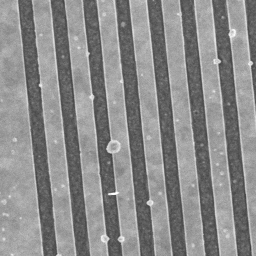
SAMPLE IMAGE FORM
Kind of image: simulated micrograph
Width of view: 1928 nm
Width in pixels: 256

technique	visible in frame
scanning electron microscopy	parallel lines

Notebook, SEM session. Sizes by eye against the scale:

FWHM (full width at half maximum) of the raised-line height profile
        126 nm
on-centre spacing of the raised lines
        242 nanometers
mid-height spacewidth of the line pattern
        112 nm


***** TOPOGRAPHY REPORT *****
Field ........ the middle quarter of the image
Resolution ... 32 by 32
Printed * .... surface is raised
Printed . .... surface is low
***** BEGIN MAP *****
..****....****....****....****..
..****....****....****....****..
..****....****....****....****..
..****....****.....****...*****.
..*****....****....****....****.
..*****....****....****....****.
...****....****....****....****.
...****....****....****....****.
...****....****....****....****.
...****....****....****....****.
...****....****....****....****.
...****....****....****....****.
...****....****....****....****.
...****....****.....****...*****
...*****....****....****....****
...*****....****....****....****
....****....****....****....****
....****....****....****....****
....****....****....****....****
....****...*****....****....****
....****...*****....****....****
....****...*****....****....****
....****....****....****....****
....****....****....*****....***
....****.....****...*****....***
*...*****....****....****....***
*....****....****....****....***
*....****....****....****....***
*....****....****....****....***
*....****....****....****....***
*....****....****....****....***
*....****....****....****....***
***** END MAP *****